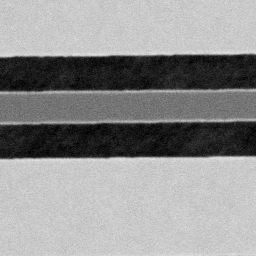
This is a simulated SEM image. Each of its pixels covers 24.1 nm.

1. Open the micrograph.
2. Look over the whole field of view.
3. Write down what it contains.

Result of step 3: lines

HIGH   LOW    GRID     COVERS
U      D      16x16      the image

UUUUUUUUUUUUUUUU
UUUUUUUUUUUUUUUU
UUUUUUUUUUUUUUUU
UDDDUDDDDDDDDDDD
DDDDDDDDDDDDDDDD
DDDDDDDDDDDDDDDD
UUUUUUUUUUUUUUUU
UUUUUUUUUUUUUUUU
DDDDDDDDDDDDDDDD
DDDDDDDDDDDDDDDD
UUUUUUUUUUUUUUUU
UUUUUUUUUUUUUUUU
UUUUUUUUUUUUUUUU
UUUUUUUUUUUUUUUU
UUUUUUUUUUUUUUUU
UUUUUUUUUUUUUUUU